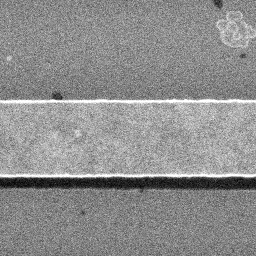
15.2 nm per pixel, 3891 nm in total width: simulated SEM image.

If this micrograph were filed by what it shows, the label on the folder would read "lines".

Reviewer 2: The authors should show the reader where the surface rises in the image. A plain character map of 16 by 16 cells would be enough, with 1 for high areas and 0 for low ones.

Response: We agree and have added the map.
0000000000000000
0000000000000000
0000000000000000
0000000000000000
0000000000000000
0000000000000000
1111111111111111
1111111111111111
1111111111111111
1111111111111111
1111111111111111
0000000000000000
0000000000000000
0000000000000000
0000000000000000
0000000000000000